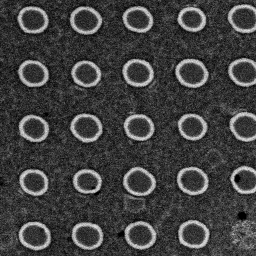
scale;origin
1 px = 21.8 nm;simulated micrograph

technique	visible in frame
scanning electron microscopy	a regular array of raised bodies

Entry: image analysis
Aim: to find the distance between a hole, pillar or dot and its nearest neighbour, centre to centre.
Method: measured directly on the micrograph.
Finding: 1150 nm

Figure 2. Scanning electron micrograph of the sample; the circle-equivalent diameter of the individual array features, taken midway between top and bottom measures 573 nm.